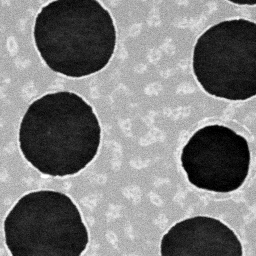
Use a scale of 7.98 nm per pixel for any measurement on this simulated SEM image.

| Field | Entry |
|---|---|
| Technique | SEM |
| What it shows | holes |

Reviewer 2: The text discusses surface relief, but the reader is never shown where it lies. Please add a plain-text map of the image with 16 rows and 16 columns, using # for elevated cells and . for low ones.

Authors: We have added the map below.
###...##########
##.....#######..
##.....#####....
###....#####....
####..######....
#############...
##...###########
#.....##########
#.....######...#
#.....#####.....
##...######.....
############...#
#...############
.....###########
.....#####.....#
#....#####.....#